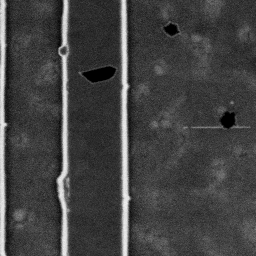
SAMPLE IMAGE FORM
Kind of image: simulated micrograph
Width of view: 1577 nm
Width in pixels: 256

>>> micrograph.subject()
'one or a few lines or trenches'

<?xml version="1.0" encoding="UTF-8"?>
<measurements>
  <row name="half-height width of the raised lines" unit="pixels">60.4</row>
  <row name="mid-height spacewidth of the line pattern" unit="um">0.383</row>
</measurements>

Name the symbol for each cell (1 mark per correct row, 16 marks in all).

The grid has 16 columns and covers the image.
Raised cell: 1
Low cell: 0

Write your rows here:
0000111100000000
0000111100000000
0000111100000000
0000111100000000
0000111100000000
0000111100000000
0000111100000000
0000111100000000
0000111100000000
0000111100000000
0000111100000000
0000111100000000
0000111100000000
0000111100000000
0000111100000000
0000111100000000